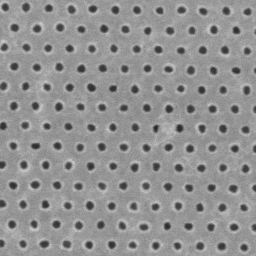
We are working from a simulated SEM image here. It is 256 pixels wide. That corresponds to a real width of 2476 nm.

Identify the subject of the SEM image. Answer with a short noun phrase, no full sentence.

a regular array of holes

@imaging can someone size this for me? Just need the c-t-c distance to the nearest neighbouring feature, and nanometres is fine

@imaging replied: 208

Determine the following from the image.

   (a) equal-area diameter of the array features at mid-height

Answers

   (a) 86.6 nm